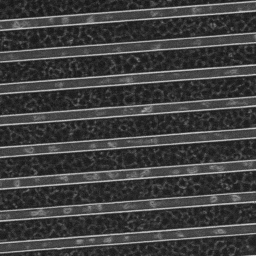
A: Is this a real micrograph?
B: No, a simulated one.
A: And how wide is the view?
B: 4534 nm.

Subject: parallel lines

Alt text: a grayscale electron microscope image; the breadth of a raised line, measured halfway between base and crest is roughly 22.7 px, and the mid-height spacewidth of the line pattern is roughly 163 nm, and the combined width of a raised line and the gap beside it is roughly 561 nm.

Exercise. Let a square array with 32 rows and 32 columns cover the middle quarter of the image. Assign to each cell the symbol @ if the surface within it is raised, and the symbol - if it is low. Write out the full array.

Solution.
@@@@@@@@@@@@@@@@@@@@@@@@@@@@@@@@
@@@@@@@@@@@@@@@@@@@@@@@@@@@@@@--
@@@@@@@@@@@@@@@@@---------------
@@@-----------------------------
-----------------------@@@@@@@@@
----------@@@@@@@@@@@@@@@@@@@@@@
@@@@@@@@@@@@@@@@@@@@@@@@@@@@@@@@
@@@@@@@@@@@@@@@@@@@@@@@@@@@@@@@@
@@@@@@@@@@@@@@@@@@@@@@@@@@@@@@@@
@@@@@@@@@@@@@@@@@@@@@@@@@@@@@@--
@@@@@@@@@@@@@@@@@---------------
@@@@----------------------------
---------------------@@@@@@@@@@@
-----------@@@@@@@@@@@@@@@@@@@@@
@@@@@@@@@@@@@@@@@@@@@@@@@@@@@@@@
@@@@@@@@@@@@@@@@@@@@@@@@@@@@@@@@
@@@@@@@@@@@@@@@@@@@@@@@@@@@@@@@@
@@@@@@@@@@@@@@@@@@@@@@@@@@@@----
@@@@@@@@@@@@@@------------------
@-------------------------------
---------------------@@@@@@@@@@@
--------@@@@@@@@@@@@@@@@@@@@@@@@
@@@@@@@@@@@@@@@@@@@@@@@@@@@@@@@@
@@@@@@@@@@@@@@@@@@@@@@@@@@@@@@@@
@@@@@@@@@@@@@@@@@@@@@@@@@@@@@@@@
@@@@@@@@@@@@@@@@@@@@@@@@@@@@----
@@@@@@@@@@@@@@@-----------------
@@------------------------------
----------------------@@@@@@@@@@
--------@@@@@@@@@@@@@@@@@@@@@@@@
@@@@@@@@@@@@@@@@@@@@@@@@@@@@@@@@
@@@@@@@@@@@@@@@@@@@@@@@@@@@@@@@@